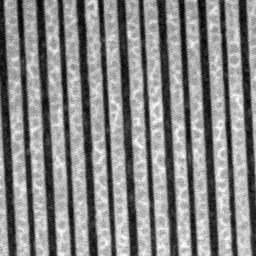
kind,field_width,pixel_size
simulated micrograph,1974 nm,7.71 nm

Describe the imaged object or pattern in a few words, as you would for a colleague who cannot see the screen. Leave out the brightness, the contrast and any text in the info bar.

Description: parallel lines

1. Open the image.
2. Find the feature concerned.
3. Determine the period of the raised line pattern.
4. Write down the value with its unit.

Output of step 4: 155 nm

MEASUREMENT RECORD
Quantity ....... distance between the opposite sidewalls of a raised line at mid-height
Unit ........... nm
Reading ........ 97.2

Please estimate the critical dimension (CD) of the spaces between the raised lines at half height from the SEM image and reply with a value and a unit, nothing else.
66.4 nm